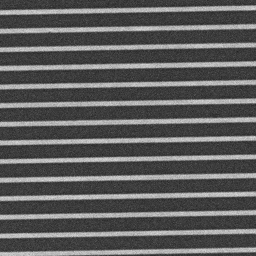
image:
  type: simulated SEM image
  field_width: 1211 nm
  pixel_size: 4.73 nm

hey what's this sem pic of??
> parallel lines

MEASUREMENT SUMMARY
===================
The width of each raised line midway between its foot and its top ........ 3.62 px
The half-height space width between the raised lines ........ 68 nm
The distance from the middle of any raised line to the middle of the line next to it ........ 88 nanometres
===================